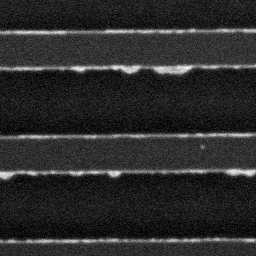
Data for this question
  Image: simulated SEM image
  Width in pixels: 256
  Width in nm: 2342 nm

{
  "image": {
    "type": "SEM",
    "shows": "lines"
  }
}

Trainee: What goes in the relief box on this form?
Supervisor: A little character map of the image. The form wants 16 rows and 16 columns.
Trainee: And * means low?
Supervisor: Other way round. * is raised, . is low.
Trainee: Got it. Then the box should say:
................
................
****************
****************
................
................
................
................
.......*********
****************
****************
................
................
................
................
****************